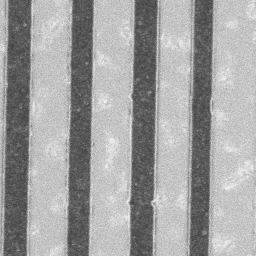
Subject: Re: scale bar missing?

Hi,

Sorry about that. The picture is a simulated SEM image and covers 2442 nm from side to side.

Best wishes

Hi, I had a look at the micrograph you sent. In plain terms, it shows one or a few lines or trenches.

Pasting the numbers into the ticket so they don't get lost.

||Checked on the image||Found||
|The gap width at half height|359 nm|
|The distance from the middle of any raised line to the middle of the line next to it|585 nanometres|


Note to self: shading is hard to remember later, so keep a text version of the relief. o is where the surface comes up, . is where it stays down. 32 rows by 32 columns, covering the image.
.ooo.....ooo.....ooo....ooo.....
.ooo.....ooo.....ooo....ooo.....
.ooo.....ooo.....ooo....ooo.....
.ooo.....ooo.....ooo....ooo.....
.ooo.....ooo.....ooo....ooo.....
.ooo.....ooo.....ooo....ooo.....
.ooo.....ooo.....ooo....ooo.....
.ooo.....ooo....oooo....ooo.....
.ooo.....ooo....oooo....ooo.....
.ooo.....ooo....oooo....ooo.....
.ooo.....ooo.....ooo....ooo.....
.ooo.....ooo....oooo....ooo.....
.ooo.....ooo....oooo....ooo.....
.ooo.....ooo....oooo....oo......
.ooo.....ooo....oooo....ooo.....
.ooo.....ooo....oooo....ooo.....
.ooo....oooo....oooo....oo......
.ooo....oooo....oooo....oo......
oooo....oooo....oooo....oo......
oooo....ooo.....oooo....oo......
oooo....ooo.....ooo.....oo......
oooo....ooo.....ooo.....oo......
oooo....ooo.....ooo.....oo......
oooo....ooo.....ooo.....oo......
oooo....ooo.....ooo.....oo......
oooo....ooo.....ooo.....oo......
oooo....ooo.....ooo.....oo......
oooo....ooo.....ooo.....oo......
oooo....ooo.....ooo.....oo......
oooo....ooo.....ooo.....oo......
oooo....ooo.....ooo.....oo......
ooo.....ooo.....ooo.....oo......